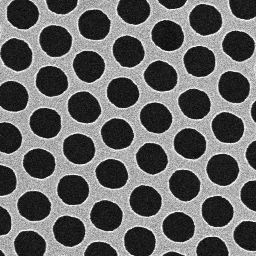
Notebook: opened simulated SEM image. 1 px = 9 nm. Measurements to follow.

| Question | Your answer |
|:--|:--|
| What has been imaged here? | a regular array of holes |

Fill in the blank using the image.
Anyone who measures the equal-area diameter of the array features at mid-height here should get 287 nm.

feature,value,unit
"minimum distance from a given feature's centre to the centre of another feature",369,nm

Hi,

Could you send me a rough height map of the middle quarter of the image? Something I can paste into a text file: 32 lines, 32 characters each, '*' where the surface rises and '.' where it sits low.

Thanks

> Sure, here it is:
**........****....***......***..
***.......**********........**..
***.......**********........***.
.***.....****...****........****
.****...***......***........****
.**********.......***.......****
.**********........****....****.
***....****........**********...
*.......***........**********...
*........***......***********...
*........****....***.....****...
*........**********.......***...
*........**********........***..
**......***********........****.
***.....***.....***........*****
**********.......***.......*****
*********........****.....***...
***.*****........******.****....
.......**........***********....
.......***.......**********.....
........***.....****....***.....
........*****.*****......***....
........**********........***...
*......***********........****..
**....***.....****........******
********.......***........******
********........****.....***..**
********........*****..****.....
.....***........**********......
......***.......**********......
......****.....****..*****......
......***********......***......